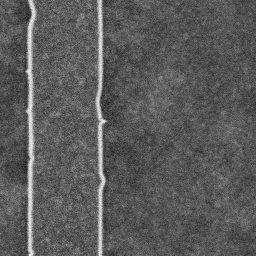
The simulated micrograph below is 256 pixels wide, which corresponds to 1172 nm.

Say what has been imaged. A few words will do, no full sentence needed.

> one or a few lines or trenches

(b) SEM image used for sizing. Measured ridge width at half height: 326 nm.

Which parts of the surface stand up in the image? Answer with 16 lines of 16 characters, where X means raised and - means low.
--XXXX----------
--XXXX----------
--XXXX----------
--XXXX----------
--XXXX----------
--XXXX----------
--XXXX----------
--XXXX----------
--XXXX----------
--XXXX----------
--XXXX----------
--XXXX----------
--XXXX----------
--XXXX----------
--XXXX----------
--XXXX----------